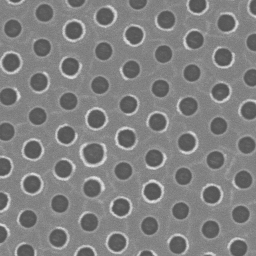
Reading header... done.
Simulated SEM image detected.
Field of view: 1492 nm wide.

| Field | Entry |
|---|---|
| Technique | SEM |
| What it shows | a regular array of holes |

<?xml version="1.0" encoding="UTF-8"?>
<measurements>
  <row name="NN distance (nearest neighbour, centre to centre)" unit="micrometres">0.197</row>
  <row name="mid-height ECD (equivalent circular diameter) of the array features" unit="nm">104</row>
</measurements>